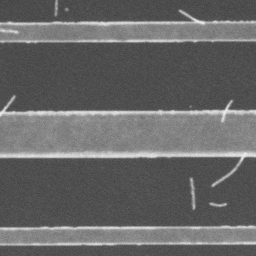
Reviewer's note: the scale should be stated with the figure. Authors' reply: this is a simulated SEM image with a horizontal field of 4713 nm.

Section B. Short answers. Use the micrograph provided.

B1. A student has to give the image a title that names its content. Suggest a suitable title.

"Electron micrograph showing lines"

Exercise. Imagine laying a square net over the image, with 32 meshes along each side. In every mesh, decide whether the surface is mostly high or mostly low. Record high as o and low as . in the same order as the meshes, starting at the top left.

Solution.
................................
................................
................................
oooooooooooooooooooooooooooooooo
oooooooooooooooooooooooooooooooo
................................
................................
................................
................................
................................
................................
................................
................................
................................
oooooooooooooooooooooooooooooooo
oooooooooooooooooooooooooooooooo
oooooooooooooooooooooooooooooooo
oooooooooooooooooooooooooooooooo
oooooooooooooooooooooooooooooooo
ooooooooooooooooooooooo.......o.
................................
................................
................................
................................
................................
................................
................................
................................
.....o.ooooooooooooooooooooooooo
oooooooooooooooooooooooooooooooo
oooooooooooooo..................
................................